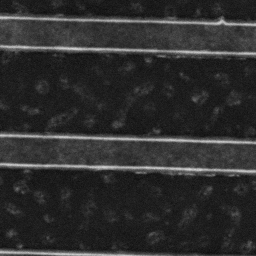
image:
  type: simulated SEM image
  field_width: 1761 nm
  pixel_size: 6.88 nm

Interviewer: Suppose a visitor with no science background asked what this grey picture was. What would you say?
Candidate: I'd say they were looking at one or a few lines or trenches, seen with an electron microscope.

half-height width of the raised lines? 197 nm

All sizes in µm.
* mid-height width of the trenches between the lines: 0.613